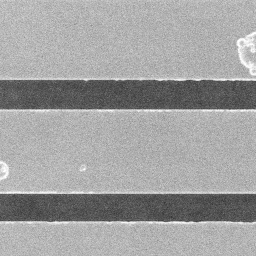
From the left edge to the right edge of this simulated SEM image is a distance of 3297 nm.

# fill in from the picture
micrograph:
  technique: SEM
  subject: lines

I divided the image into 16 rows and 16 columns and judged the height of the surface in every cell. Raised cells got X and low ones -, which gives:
XXXXXXXXXXXXXXXX
XXXXXXXXXXXXXXXX
XXXXXXXXXXXXXXXX
XXXXXXXXXXXXXXXX
XXXXXXXXXXXXXXXX
----------------
----------------
XXXXXXXXXXXXXXXX
XXXXXXXXXXXXXXXX
XXXXXXXXXXXXXXXX
XXXXXXXXXXXXXXXX
XXXXXXXXXXXXXXXX
----------------
----------------
XXXXXXXXXXXXXXXX
XXXXXXXXXXXXXXXX